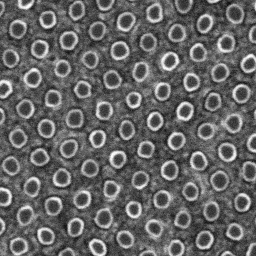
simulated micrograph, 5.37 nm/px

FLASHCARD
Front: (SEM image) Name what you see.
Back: a regular array of raised bodies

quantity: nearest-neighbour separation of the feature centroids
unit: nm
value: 156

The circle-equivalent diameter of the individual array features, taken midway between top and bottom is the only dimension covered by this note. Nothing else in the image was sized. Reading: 90.8 nm